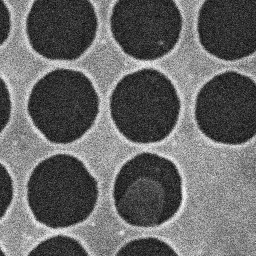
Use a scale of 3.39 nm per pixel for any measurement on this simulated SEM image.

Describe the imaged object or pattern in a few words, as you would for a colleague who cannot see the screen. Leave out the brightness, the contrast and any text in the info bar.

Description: holes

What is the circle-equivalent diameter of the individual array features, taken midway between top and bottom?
247 nm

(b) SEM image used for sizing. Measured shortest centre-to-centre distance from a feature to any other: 82.9 px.